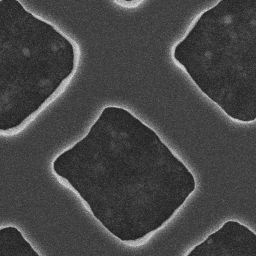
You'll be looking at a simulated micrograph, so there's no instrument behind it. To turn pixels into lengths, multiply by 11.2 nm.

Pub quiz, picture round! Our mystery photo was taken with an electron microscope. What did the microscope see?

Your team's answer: holes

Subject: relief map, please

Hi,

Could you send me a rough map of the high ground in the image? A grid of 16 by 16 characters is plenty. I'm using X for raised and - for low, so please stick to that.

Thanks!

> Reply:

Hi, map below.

--XXXXXXXXXXX---
---XXXXXXXXX----
----XXXXXXX-----
-----XXXXXX-----
----XXXXXXXX----
----XXXXXXXX----
---XXXXXXXXXXX--
--XXXX---XXXXXX-
XXXXX-----XXXXXX
XXXX-------XXXXX
XXX---------XXXX
XXXX--------XXXX
XXXXX-------XXXX
XXXXXX-----XXXXX
-XXXXXX--XXXX---
--XXXXXXXXXX----